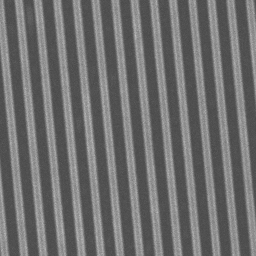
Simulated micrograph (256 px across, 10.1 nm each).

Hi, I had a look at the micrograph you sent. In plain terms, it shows parallel lines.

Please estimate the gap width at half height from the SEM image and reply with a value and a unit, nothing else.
127 nanometers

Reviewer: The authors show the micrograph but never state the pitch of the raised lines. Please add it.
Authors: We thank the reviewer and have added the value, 194 nm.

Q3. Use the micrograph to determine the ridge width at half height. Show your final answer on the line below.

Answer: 73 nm